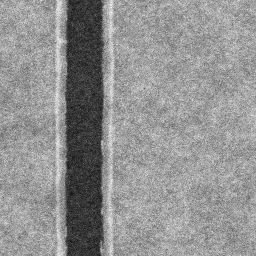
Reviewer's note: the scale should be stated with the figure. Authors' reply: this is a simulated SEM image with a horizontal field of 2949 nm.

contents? one or a few lines or trenches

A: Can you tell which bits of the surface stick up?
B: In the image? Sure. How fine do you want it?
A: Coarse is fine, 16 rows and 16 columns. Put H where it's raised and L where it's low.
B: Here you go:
HHHHLLLHHHHHHHHH
HHHHLLLHHHHHHHHH
HHHHLLLHHHHHHHHH
HHHHLLLHHHHHHHHH
HHHHLLLHHHHHHHHH
HHHHLLLHHHHHHHHH
HHHHLLLHHHHHHHHH
HHHHLLLHHHHHHHHH
HHHHLLLHHHHHHHHH
HHHHLLLHHHHHHHHH
HHHHLLLHHHHHHHHH
HHHHLLLHHHHHHHHH
HHHHLLLHHHHHHHHH
HHHHLLLHHHHHHHHH
HHHHLLLHHHHHHHHH
HHHHLLLHHHHHHHHH